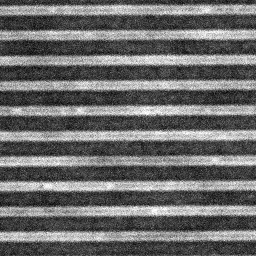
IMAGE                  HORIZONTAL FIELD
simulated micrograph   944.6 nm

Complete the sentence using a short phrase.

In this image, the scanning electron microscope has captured parallel lines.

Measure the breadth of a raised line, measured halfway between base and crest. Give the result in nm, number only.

28.6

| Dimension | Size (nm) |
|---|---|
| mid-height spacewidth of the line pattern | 64.1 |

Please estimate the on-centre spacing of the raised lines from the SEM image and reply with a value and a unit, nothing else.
92.6 nanometres